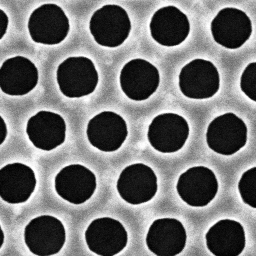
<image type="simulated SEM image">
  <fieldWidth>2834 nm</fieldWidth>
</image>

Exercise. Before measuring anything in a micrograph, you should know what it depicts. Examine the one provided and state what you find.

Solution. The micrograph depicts a regular array of holes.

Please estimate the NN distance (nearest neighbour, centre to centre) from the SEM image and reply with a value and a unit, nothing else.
59.6 px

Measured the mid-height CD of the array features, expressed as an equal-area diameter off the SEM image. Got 41.7 pixels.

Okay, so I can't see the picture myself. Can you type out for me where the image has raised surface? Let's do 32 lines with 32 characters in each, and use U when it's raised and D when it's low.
UUUUUUDUUUUUUUUUUUUUUUUUUUUUUUUU
UUUUDDDDUUUUDDDDUUUDDDDUUUUDDDUU
DUUUDDDDDUUDDDDDUUUDDDDDUUUDDDDU
DUUDDDDDDUUDDDDDUUUDDDDDUUDDDDDD
DUUUDDDDUUUUDDDDUUUDDDDUUUDDDDDU
UUUUUDDUUUUUDDDUUUUUDDDUUUUDDDUU
UUUUUUUUUUUUUUUUUUUUUUUUUUUUUUUU
UDDDUUUUDDDUUUUUDDUUUUUUDDUUUUUU
DDDDDUUDDDDDUUUDDDDDUUUDDDDUUUUD
DDDDDUUDDDDDUUUDDDDDUUDDDDDUUUDD
DDDDDUUDDDDDUUUDDDDDUUDDDDDUUUDD
UDDDUUUUDDDDUUUDDDDUUUUDDDDUUUDD
UUUUUUUUUUUUUUUUUDUUUUUUUUUUUUUD
UUUUUUUUUUUUUUUUUUUUUUUUUUUUUUUU
UUUUDDDDUUUUDDDUUUUUDDDUUUUDDDUU
DUUDDDDDUUUDDDDDUUUDDDDUUUDDDDDU
DUUDDDDDUUUDDDDDUUDDDDDDUUDDDDDU
DUUUDDDDUUUDDDDDUUDDDDDUUUDDDDDU
UUUUUDDUUUUUDDDUUUUDDDDUUUDDDDUU
UUUUUUUUUUUUUUUUUUUUUUUUUUUUUUUU
UDDUUUUUUUUUUUUUDDUUUUUUUUUUUUUU
DDDDUUUDDDDDUUUDDDDUUUUDDDDUUUUD
DDDDUUUDDDDDUUUDDDDDUUDDDDDUUUDD
DDDDUUUDDDDDUUUDDDDDUUDDDDDUUUDD
DDDDUUUDDDDUUUUDDDDUUUDDDDDUUUDD
UUUUUUUUUDUUUUUUDDUUUUUDDDUUUUUD
UUUUUUUUUUUUUUUUUUUUUUUUUUUUUUUU
UUUUDDDUUUUUDDDUUUUDDDUUUUUUDUUU
UUUDDDDDUUUDDDDDUUUDDDDUUUDDDDUU
UUUDDDDDUUUDDDDDUUDDDDDUUUDDDDDU
UUUDDDDDUUUDDDDDUUDDDDDUUUDDDDDU
UUUUDDDUUUUUDDDUUUUDDDDUUUDDDDUU